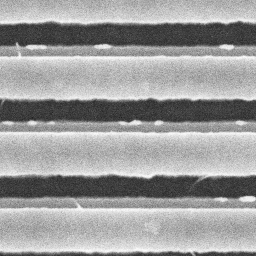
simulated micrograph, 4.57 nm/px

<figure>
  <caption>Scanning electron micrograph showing lines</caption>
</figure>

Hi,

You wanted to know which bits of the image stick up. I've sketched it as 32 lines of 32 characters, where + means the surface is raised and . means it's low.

++++++++++++++++++++++++++++++++
++++++++++++++++++++++++++++++++
++++++++++++++++++++++++++++++++
................................
................................
................................
++++++++++++++++++++++++++++++++
++++++++++++++++++++++++++++++++
++++++++++++++++++++++++++++++++
++++++++++++++++++++++++++++++++
++++++++++++++++++++++++++++++++
++++++++++++++++++++++++++++++++
................................
................................
................................
++++++++++++++++++++++++++++++++
++++++++++++++++++++++++++++++++
++++++++++++++++++++++++++++++++
++++++++++++++++++++++++++++++++
++++++++++++++++++++++++++++++++
++++++++++++++++++++++++++++++++
++++++++++++++++++++++++++++++++
................................
................................
................................
++++++++++++++++++++++++++++++++
++++++++++++++++++++++++++++++++
++++++++++++++++++++++++++++++++
++++++++++++++++++++++++++++++++
++++++++++++++++++++++++++++++++
++++++++++++++++++++++++++++++++
...........+.+.........+++......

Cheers